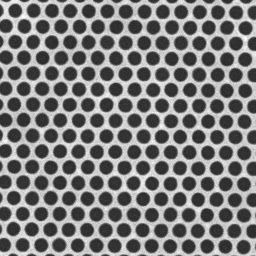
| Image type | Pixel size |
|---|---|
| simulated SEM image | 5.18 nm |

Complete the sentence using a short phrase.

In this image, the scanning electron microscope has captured a regular array of holes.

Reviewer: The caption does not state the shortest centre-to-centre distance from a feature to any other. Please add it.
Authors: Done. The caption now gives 92.4 nanometres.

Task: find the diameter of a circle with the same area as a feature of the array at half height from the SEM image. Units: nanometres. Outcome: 71.2